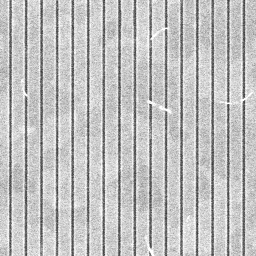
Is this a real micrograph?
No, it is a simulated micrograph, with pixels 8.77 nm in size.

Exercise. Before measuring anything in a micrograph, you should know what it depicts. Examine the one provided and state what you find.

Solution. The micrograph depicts parallel lines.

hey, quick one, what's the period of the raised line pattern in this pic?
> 136 nm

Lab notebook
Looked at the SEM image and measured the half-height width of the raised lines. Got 108 nm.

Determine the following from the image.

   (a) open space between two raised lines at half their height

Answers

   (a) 26.3 nanometers